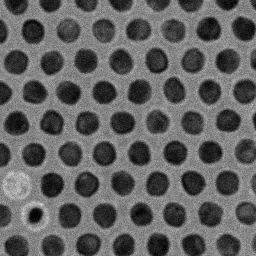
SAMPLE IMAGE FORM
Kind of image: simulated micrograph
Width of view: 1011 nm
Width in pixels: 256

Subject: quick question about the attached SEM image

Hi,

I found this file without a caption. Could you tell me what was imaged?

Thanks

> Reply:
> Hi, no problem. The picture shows a regular array of holes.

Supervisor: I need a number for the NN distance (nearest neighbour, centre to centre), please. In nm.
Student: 136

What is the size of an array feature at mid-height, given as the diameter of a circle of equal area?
99.8 nm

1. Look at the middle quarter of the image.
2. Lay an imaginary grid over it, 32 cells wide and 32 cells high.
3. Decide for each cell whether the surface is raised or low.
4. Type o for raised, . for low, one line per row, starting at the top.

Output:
ooo.....ooo.......ooo.....ooo...
ooo.....oooo.....oooo....ooooo..
ooooooooooooo...oooooo.ooooooooo
oooooooooooooooooooooooooo...ooo
..oooooo...oooooo....oooo....ooo
....ooo.....oooo......ooo.....oo
....ooo......ooo......ooo.....oo
....ooo......ooo......ooo......o
....ooo......ooo......oooo....oo
....oooo....ooooo....ooooo....oo
oooooooooooooooooooooooooooooooo
oooooooooooooooooooooo..oooooooo
oooo....oooo.....oooo....ooooo..
ooo......ooo......oo......oooo..
ooo......ooo......oo.......oo...
ooo......ooo......ooo......oo...
ooo.....oooo.....oooo.....oooo..
oooo...oooooo..ooooooo..ooooooo.
oooooooooooooooooooooooooooooooo
o..oooooo...ooooo...ooooooo..ooo
....oooo.....oooo....oooo......o
.....oo......ooo.....oooo......o
.....oo......ooo......ooo......o
.....oo......ooo......ooo......o
....oooo.....oooo.....oooo....oo
o..oooooo...oooooo...ooooooo.ooo
ooooooooooooooooooooooooooooooo.
oooo...ooooo....ooooo....ooooo..
ooo.....oooo.....oooo.....ooo...
ooo......ooo......ooo.....ooo...
oo.......ooo......oo......oooo..
ooo.....oooo.....oooo.....oooo..